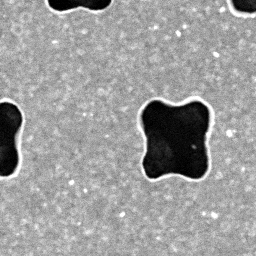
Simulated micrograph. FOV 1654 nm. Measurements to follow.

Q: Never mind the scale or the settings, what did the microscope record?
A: holes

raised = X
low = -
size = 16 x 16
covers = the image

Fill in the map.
XXX----XXXXXXXX-
XXXXXXXXXXXXXXXX
XXXXXXXXXXXXXXXX
XXXXXXXXXXXXXXXX
XXXXXXXXXXXXXXXX
XXXXXXXXXXXXXXXX
-XXXXXXXX--X-XXX
-XXXXXXXX----XXX
-XXXXXXXX----XXX
-XXXXXXXX----XXX
-XXXXXXXX----XXX
XXXXXXXXXXXXXXXX
XXXXXXXXXXXXXXXX
XXXXXXXXXXXXXXXX
XXXXXXXXXXXXXXXX
XXXXXXXXXXXXXXXX